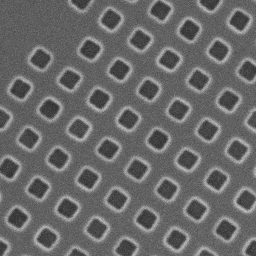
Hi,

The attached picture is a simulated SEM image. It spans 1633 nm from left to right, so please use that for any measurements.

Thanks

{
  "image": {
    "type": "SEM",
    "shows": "a regular array of holes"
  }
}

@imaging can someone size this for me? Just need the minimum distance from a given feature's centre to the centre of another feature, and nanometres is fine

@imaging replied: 227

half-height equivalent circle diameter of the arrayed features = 19 pixels